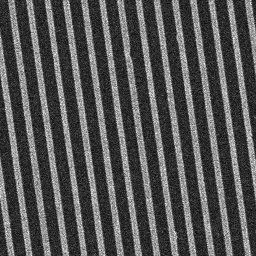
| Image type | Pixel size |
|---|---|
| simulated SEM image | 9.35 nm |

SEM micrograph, parallel lines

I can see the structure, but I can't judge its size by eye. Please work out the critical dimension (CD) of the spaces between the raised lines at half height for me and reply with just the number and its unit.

120 nm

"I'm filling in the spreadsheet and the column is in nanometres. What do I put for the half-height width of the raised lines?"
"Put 48.6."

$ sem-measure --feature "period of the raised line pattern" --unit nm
169